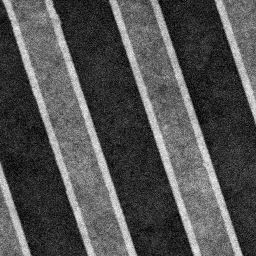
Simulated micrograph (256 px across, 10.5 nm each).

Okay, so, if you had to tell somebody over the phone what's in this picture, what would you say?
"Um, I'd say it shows one or a few lines or trenches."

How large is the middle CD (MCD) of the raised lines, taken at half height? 407 nm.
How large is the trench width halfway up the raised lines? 648 nm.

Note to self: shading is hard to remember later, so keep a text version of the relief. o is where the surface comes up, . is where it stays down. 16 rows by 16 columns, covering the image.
.oo....ooo....oo
.ooo....oo....oo
.ooo....oo.....o
..oo....ooo....o
..oo.....oo....o
..ooo....oo.....
...oo....ooo....
...oo.....oo....
...ooo....oo....
....oo....ooo...
....oo.....oo...
....ooo....oo...
o....oo....ooo..
o....oo.....oo..
o....ooo....oo..
oo....oo....ooo.